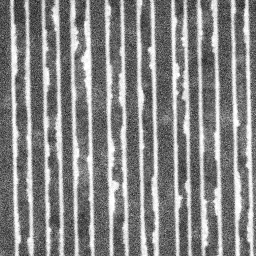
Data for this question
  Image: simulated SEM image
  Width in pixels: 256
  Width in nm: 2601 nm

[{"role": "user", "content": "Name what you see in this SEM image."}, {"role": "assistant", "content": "parallel lines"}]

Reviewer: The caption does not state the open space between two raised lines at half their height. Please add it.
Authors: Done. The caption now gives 0.165 micrometres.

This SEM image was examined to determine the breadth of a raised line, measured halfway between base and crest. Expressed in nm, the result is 155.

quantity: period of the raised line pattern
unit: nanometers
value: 320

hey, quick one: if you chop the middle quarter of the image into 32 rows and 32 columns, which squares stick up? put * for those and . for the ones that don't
..****.....****....***......***.
..****.....****....***......***.
..****.....****....***......***.
..****.....****....***......***.
..****.....****....***......***.
..****.....****....***......***.
..****.....****....***......***.
..****.....****....***......***.
..****.....****....***......***.
...***.....****....***......***.
...***.....****....***......***.
...***.....****....***......***.
...***.....****....***......***.
...***.....****....***......***.
...****....****....****.....***.
...****....****....****.....***.
...****....****....****.....***.
...****....****....****.....***.
...****....****....****.....***.
...****....****....****.....***.
...****.....***....****.....***.
...****.....***....****.....***.
...****.....***....****.....***.
...****.....***....****.....***.
...****.....***....****.....***.
...****.....***....****.....***.
...****.....***....****.....***.
...****.....***....****.....***.
...****.....***....****.....***.
...****.....***....****.....***.
...****.....***....****.....***.
...****.....***.....***.....***.